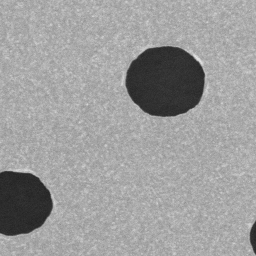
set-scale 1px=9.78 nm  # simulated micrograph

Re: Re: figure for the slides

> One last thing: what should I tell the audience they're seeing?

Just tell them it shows holes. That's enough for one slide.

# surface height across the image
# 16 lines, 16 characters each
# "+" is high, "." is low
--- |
++++++++++++++++
++++++++++++++++
++++++++++++++++
+++++++++...++++
++++++++.....+++
++++++++.....+++
+++++++++...++++
++++++++++++++++
++++++++++++++++
++++++++++++++++
++++++++++++++++
...+++++++++++++
...+++++++++++++
...+++++++++++++
..++++++++++++++
++++++++++++++++